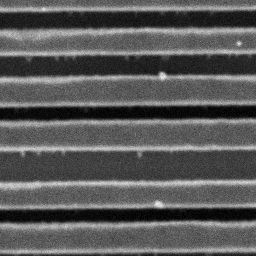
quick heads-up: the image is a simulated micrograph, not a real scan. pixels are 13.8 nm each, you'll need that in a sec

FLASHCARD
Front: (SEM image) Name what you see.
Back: lines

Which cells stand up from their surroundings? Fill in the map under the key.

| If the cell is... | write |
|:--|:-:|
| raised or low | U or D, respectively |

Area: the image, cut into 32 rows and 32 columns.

UUUUUUUUUUUUUUUUUUUUUUUUUUUUUUUU
DDDDDDDDDDDDDDDDDDDDDDDDDDDDDDDD
DDDDDDDDDDDDDDDDDDDDDDDDDDDDDDDD
DDDDDDDDDDDDDDDDDDUUDUDUUDUUUUUU
UUUUUUUUUUUUUUUUUUUUUUUUUUUUUUUU
UUUUUUUUUUUUUUUUUUUUUUUUUUUUUUUU
UUUUUUUUUUUUUUUUUUUUUUUUUUUUUUUU
DDDDDDDDDDDDDDDDDDDDDDDDDDDDDDDD
DDDDDDDDDDDDDDDDDDDDDDDDDDDDDDDD
DDDDDDDDDDDDUDUUUUUUUUUUUUUUUUUU
UUUUUUUUUUUUUUUUUUUUUUUUUUUUUUUU
UUUUUUUUUUUUUUUUUUUUUUUUUUUUUUUU
UUUUUUUUUUUUUUUUUUUUUUUUUUUUUUUU
DDDDDDDDDDDDDDDDDDDDDDDDDDDDDDDD
DDDDDDDDDDDDDDDDDDDDDDDDDDDDDDDD
UUUUUUUUUUUUUUUUUUUUUUUUUUUUUUUU
UUUUUUUUUUUUUUUUUUUUUUUUUUUUUUUU
UUUUUUUUUUUUUUUUUUUUUUUUUUUUUUUU
UUUUUUUUUUUUUUUUUUUUUUUUUUUUUUUU
DDDDDDDDDDDDDDDDDDDDDDDDDDDDDDDD
DDDDDDDDDDDDDDDDDDDDDDDDDDDDDDDD
DDDDDDDDDDDDDDDDDDDDDDDDDDDDDDDD
DDDDDDDDDDDDDDDDDDDDDDDDDDDDDDDD
UUUUUUUUUUUUUUUUUUUUUUUUUUUUUUUU
UUUUUUUUUUUUUUUUUUUUUUUUUUUUUUUU
UUUUUUUUUUUUUUUUUUUUUUUUUUUUUUUU
DDDDDDDDDDDDDDDDDDDDDDDDDDDDDDDD
DDDDDDDDDDDDDDDDDDDDDDDDDDDDDDDD
UUUUUUUUUUUUUUUUUUUUUUUUUUUUUUUU
UUUUUUUUUUUUUUUUUUUUUUUUUUUUUUUU
UUUUUUUUUUUUUUUUUUUUUUUUUUUUUUUU
UUUUUUUUUUUUUUUUUUUUUUUUUUUUUUUU